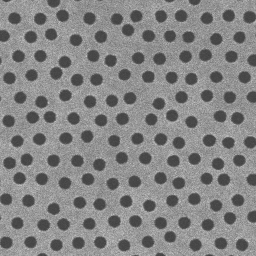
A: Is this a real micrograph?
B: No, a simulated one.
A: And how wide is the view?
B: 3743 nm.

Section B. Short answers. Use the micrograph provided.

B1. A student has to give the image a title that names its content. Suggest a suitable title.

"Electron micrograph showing a regular array of holes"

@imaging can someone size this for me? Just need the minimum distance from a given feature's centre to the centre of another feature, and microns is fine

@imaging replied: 0.298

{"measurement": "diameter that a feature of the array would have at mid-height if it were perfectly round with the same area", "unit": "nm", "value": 187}